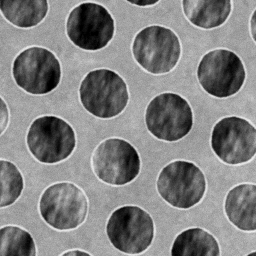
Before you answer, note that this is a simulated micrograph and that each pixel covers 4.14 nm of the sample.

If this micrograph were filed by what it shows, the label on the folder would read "a regular array of holes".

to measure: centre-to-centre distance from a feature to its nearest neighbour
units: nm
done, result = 283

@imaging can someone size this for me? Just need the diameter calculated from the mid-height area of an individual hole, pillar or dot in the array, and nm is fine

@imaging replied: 202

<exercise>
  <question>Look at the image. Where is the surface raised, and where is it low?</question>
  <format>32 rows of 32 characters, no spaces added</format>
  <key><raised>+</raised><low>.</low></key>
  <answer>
......++++..+++++..++++......+++
......+++.....+++++++++......+++
+....+++......++++++++++....+++.
++++++++......++++...++++..++++.
++++++++......+++.....+++++++++.
+++++++++....++++......+++++++++
+++...+++++++++++......+++...+++
++.....++++++++++.....+++.....++
++......++++++++++....+++......+
++......+++....++++++++++......+
++.....+++......+++++++++.....++
+++...++++......++++++++++....++
++++++++++......+++....+++++++++
.++++++++++.....++......++++++++
.++++..+++++..++++......++++++++
.+++.....+++++++++......+++....+
+++......++++++++++.....++......
+++......++++..+++++..++++......
++++.....+++.....+++++++++......
++++.....+++.....++++++++++.....
..++++++++++......+++...++++..++
...+++++++++.....+++.....+++++++
...++++++++++....+++......++++++
...+++....++++++++++......+++...
..+++......+++++++++.....+++....
..+++......++++++++++....+++....
+++++......+++....++++++++++....
++++++.....+++.....++++++++++...
...++++..++++......+++++.+++++..
....+++++++++......+++.....+++++
....++++++++++.....+++.....+++++
.....+++...++++...+++......+++++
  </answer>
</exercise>